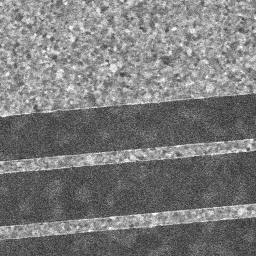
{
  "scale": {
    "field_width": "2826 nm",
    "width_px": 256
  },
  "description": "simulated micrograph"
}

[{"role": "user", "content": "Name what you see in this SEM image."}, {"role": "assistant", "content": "one or a few lines or trenches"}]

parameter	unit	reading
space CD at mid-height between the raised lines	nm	505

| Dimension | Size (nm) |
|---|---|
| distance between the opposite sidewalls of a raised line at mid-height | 136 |